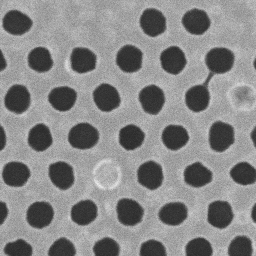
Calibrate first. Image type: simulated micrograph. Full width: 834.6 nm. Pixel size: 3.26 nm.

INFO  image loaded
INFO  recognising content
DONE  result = a regular array of holes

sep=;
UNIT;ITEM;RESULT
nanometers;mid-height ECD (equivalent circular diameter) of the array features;84.9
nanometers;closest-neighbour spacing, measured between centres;141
